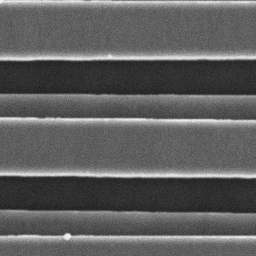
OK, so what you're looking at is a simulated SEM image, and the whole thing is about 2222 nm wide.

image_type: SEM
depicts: lines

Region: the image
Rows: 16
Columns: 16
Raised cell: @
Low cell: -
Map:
@@@@@@@@@@@@@@@@
@@@@@@@@@@@@@@@@
@@@@@@@@@@@@@@@@
@@@@@@@@@@@@@@@@
----------------
----------------
@@@@@@@@@@@@@@@@
@@@@@@@@@@@@@@@@
@@@@@@@@@@@@@@@@
@@@@@@@@@@@@@@@@
@@@@@@@@@@@@@@@@
----------------
----------------
@@@@@@@@@@@@@@@@
@@@@@@@@@@@@@@@@
@@@@@@@@@@@@@@@@